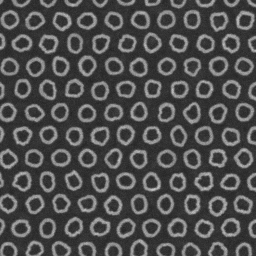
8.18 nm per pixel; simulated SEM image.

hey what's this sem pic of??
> a regular array of ring-shaped raised bodies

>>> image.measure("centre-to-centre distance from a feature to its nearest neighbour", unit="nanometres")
210